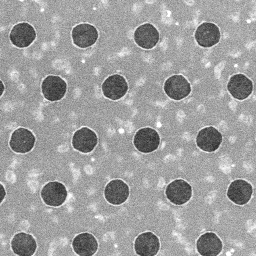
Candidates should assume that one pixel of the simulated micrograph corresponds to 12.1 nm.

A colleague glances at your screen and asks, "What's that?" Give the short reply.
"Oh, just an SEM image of a regular array of raised bodies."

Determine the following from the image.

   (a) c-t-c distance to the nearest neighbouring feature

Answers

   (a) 732 nm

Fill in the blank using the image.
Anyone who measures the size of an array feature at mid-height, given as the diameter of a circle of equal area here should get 325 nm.